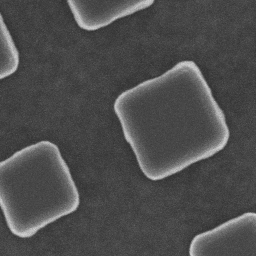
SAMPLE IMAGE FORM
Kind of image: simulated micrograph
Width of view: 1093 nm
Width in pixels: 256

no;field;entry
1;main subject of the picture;raised bodies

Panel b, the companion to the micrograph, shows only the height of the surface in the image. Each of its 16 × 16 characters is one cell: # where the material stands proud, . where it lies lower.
.....####.......
.....##.........
#...............
#...............
#.........##....
........#####...
.......######...
........######..
........######..
.###....#####...
####.....##.....
#####...........
#####...........
####...........#
.#...........###
............####